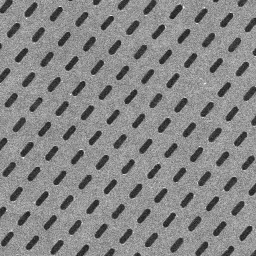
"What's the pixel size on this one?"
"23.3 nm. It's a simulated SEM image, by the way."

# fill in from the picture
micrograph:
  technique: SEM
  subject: a regular array of holes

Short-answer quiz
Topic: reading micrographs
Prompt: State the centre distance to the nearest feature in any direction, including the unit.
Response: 592 nanometres